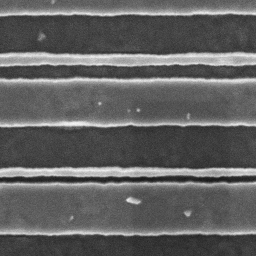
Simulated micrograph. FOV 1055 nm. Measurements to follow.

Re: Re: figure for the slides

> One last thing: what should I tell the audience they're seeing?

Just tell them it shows lines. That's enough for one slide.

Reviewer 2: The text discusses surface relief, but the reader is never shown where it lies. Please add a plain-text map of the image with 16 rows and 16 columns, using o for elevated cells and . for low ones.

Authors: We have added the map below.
oooooooooooooooo
................
................
ooooo.oooooooooo
oooooooooooooooo
oooooooooooooooo
oooooooooooooooo
oooooooooooooooo
................
................
................
oooooooooooooooo
oooooooooooooooo
oooooooooooooooo
oooooooooooooooo
................